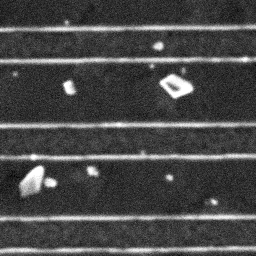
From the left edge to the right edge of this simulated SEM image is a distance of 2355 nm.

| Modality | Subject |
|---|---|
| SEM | lines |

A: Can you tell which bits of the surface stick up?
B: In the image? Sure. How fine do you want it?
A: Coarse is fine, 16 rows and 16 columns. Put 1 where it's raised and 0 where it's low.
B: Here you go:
1111111111111111
1111111111111111
0000000000000000
0000000000000000
1111111111111111
1111111111111111
1111111111111111
1111111111111111
0000000000000000
0000000000000000
1111111111111111
1111111111111111
1111111111111111
1111111111111111
0000000000000000
0000000000000011